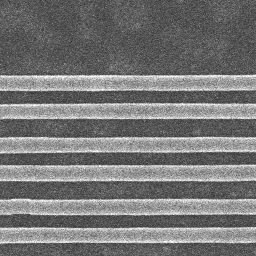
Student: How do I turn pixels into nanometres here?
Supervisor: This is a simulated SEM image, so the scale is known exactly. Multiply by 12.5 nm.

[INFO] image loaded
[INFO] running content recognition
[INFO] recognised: parallel lines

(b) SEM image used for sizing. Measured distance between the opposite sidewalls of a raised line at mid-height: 187 nm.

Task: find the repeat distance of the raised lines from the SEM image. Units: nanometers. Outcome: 381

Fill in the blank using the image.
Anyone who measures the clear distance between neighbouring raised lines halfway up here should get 176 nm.